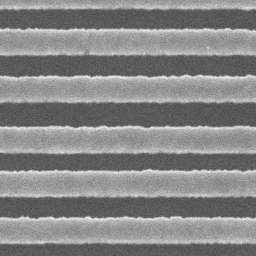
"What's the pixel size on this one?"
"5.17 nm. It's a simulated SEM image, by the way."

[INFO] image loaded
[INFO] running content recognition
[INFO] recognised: lines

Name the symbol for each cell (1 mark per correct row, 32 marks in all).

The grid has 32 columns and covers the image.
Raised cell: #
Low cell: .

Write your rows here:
################################
................................
................................
................................
################################
################################
################################
................................
................................
.......................#.#.....#
################################
################################
################################
................................
................................
................................
################################
################################
################################
................................
................................
################################
################################
################################
################################
................................
................................
################################
################################
################################
................................
................................